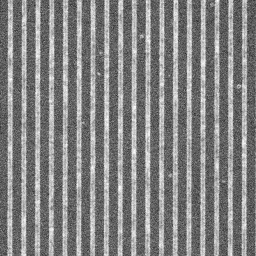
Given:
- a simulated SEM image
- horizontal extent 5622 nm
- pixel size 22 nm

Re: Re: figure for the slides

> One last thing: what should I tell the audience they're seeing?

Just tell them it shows parallel lines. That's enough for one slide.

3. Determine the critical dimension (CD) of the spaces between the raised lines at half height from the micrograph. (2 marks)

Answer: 222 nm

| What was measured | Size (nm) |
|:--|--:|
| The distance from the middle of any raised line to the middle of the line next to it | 302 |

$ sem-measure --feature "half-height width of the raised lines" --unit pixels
3.37